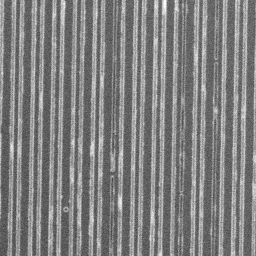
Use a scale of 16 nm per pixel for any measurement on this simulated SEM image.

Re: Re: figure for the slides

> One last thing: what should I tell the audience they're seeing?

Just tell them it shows parallel lines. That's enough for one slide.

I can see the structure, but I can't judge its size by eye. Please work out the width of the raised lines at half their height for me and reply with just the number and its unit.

54.1 nm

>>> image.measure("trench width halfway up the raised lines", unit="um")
0.134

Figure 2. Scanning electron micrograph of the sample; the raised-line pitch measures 162 nm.